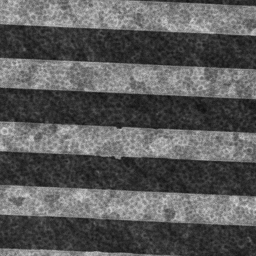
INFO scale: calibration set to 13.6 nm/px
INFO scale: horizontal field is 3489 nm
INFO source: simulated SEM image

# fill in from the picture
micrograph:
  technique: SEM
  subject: one or a few lines or trenches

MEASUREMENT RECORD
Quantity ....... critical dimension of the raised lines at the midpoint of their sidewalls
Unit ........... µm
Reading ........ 0.386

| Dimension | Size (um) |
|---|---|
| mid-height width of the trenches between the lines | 0.476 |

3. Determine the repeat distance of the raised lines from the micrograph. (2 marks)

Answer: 0.864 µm